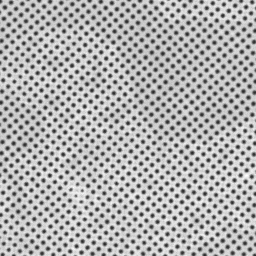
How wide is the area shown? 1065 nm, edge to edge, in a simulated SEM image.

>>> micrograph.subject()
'a regular array of holes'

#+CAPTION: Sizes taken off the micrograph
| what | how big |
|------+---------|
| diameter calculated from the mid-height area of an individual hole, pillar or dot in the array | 21 nm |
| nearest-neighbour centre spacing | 7.74 pixels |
